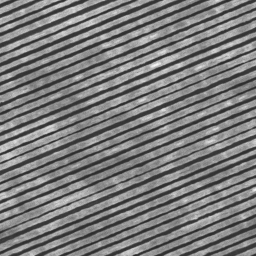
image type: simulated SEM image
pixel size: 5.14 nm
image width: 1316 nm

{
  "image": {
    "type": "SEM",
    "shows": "parallel lines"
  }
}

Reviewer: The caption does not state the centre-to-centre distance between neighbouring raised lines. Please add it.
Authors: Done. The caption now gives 46.8 nm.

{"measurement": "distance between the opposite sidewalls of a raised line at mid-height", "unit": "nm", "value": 31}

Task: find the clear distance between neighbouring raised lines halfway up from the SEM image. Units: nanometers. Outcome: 13.7